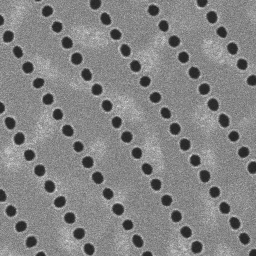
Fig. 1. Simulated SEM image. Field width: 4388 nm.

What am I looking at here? a regular array of holes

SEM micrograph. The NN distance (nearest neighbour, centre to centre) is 316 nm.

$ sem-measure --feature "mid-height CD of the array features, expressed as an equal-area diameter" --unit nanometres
203